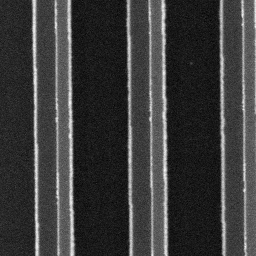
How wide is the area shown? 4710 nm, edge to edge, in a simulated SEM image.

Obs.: lines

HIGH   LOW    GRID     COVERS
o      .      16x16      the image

..oo....oo....oo
..oo....oo....oo
..oo....oo....oo
..oo....oo....oo
..oo....oo....oo
..oo....oo....oo
..oo....oo....oo
..oo....oo....oo
..oo....oo....oo
..oo....oo....oo
..oo....oo....oo
..oo....oo....oo
..oo....oo....oo
..oo....oo....oo
..oo....oo....oo
..oo....oo....oo